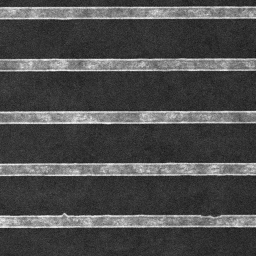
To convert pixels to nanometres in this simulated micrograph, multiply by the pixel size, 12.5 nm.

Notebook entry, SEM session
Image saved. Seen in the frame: parallel lines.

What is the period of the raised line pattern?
655 nm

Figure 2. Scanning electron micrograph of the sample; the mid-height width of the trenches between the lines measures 0.516 um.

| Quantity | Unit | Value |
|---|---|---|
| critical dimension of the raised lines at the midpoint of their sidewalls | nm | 130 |